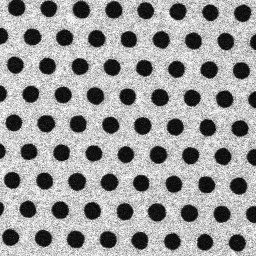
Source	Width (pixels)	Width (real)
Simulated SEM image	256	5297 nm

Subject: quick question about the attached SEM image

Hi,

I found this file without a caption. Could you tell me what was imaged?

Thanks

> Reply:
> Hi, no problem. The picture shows a regular array of holes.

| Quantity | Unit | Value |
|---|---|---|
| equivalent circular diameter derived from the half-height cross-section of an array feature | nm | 354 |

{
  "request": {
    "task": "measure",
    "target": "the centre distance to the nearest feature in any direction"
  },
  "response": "668 nm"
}